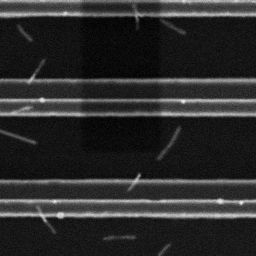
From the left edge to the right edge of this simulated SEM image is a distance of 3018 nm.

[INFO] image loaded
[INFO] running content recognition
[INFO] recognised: lines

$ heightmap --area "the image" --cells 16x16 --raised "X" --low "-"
XXXXXXXXXXXXXXXX
----------------
----------------
----------------
----------------
XXXXXXXXXXXXXXXX
XXXXXXXXXXXXXXXX
----------------
----------------
----------------
----------------
XXXXXXXXXXXXXXXX
XXXXXXXXXXXXXXXX
---X------------
----------------
----------------